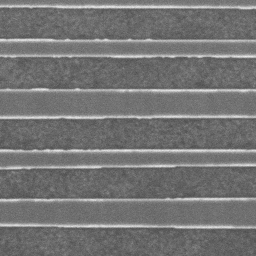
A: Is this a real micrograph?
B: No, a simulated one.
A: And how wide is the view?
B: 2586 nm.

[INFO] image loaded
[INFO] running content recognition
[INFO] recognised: lines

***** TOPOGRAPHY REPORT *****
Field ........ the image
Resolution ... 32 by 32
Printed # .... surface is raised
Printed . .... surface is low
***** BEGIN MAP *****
################################
................................
................................
................................
................................
################################
################################
................................
................................
................................
................................
################################
################################
################################
################################
................................
................................
................................
................................
################################
################################
................................
................................
................................
................................
################################
################################
################################
................................
................................
................................
................................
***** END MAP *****